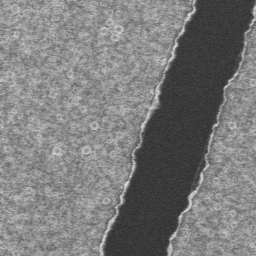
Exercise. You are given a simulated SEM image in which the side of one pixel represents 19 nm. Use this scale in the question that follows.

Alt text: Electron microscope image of one or a few lines or trenches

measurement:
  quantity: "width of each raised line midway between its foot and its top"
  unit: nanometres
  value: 1260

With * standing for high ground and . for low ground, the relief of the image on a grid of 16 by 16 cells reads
............****
............****
...........****.
...........****.
..........*****.
..........****..
..........****..
.........*****..
.........****...
........*****...
........*****...
........****....
........****....
.......****.....
.......****.....
......*****.....